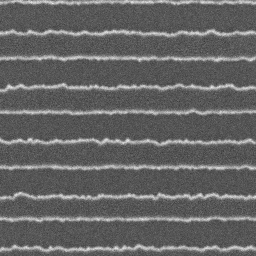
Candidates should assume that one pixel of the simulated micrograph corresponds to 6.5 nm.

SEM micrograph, lines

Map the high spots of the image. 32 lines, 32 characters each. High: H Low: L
LLLLLLLLHLLLLLLLLLLLLLHLLLLHLLLL
LLLLLLLLLLLLLLLLLLLLLLLLLLLLLLLL
LLLLLLLLLLLLLLLLLLLLLLLLLLLLLLLL
LLLLLLLLLLLLLLLLLLLLLLLLLLLLLLLL
HHHHHHHHHHHHHHHHHHHHHHHHHHHHHHHH
HHHHHHHHHHHHHHHHHHHHHHHHHHHHHHHH
HHHHHHHHHHHHHHHHHHHHHHHHHHHHHHHH
LLLLLLLLLLLLLLLLLLLLLLLLLLHHLLLL
LLLLLLLLLLLLLLLLLLLLLLLLLLLLLLLL
LLLLLLLLLLLLLLLLLLLLLLLLLLLLLLLL
LLLLLLLLLLLLLLLLLLLLLLLLLLLLLLLL
HHHHHHHHHHHHHHHHHHHHHHHHHHHHHHHH
HHHHHHHHHHHHHHHHHHHHHHHHHHHHHHHH
HHHHHHHHHHHHHHHHHHHHHHHHHHHHHHHH
LLLLLLLLLLLLLLLLLLLLLLLLLLLLLLLL
LLLLLLLLLLLLLLLLLLLLLLLLLLLLLLLL
LLLLLLLLLLLLLLLLLLLLLLLLLLLLLLLL
LLLLLLLLLLHHLHLLLLLLLLLLLLLLLLLL
HHHHHHHHHHHHHHHHHHHHHHHHHHHHHHHH
HHHHHHHHHHHHHHHHHHHHHHHHHHHHHHHH
HHHHHHHHHHHHHHHHHHHHHHHHHHHHHHHH
LLLLLLLLLLLLLLLLLLLLLLLLLLLLLLLL
LLLLLLLLLLLLLLLLLLLLLLLLLLLLLLLL
LLLLLLLLLLLLLLLLLLLLLLLLLLLLLLLL
LHHHLLHHLHLLHHLHHLHHHLHHHHHLHLLL
HHHHHHHHHHHHHHHHHHHHHHHHHHHHHHHH
HHHHHHHHHHHHHHHHHHHHHHHHHHHHHHHH
LHHLHHLHHHHHHHLHHHHLLHHHHHLLHLLL
LLLLLLLLLLLLLLLLLLLLLLLLLLLLLLLL
LLLLLLLLLLLLLLLLLLLLLLLLLLLLLLLL
LLLLLLLLLLLLLLLLLLLLLLLLLLLLLLLL
HHHHHHHHHHHHHHHHHHHHHHHHHHHHHHHH